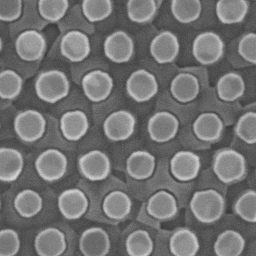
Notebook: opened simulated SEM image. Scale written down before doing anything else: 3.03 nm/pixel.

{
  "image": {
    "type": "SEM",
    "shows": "a regular array of raised bodies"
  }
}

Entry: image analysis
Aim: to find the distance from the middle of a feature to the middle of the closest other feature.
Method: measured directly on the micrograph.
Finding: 133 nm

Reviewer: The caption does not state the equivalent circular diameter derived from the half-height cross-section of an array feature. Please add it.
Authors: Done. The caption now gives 85.5 nanometers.